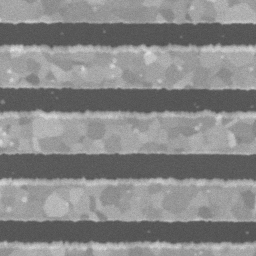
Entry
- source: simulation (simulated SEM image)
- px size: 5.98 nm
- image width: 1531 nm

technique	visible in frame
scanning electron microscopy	lines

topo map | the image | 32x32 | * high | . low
********************************
********************************
********************************
................................
................................
................................
********************************
********************************
********************************
********************************
********************************
................................
................................
................................
********************************
********************************
********************************
********************************
********************************
................................
................................
................................
**********************.*****..*.
********************************
********************************
********************************
********************************
********************************
................................
................................
*********************.**********
********************************